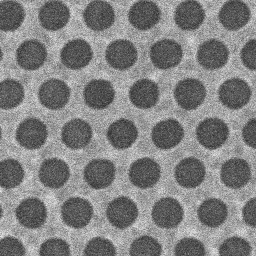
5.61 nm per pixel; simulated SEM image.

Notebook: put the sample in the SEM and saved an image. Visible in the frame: a regular array of holes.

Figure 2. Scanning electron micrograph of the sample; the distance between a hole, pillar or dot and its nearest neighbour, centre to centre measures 0.252 um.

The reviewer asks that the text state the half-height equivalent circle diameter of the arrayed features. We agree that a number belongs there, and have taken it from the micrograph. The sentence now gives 186 nm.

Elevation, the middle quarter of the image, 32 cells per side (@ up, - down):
------@@@@@------@@@@@------@@@@
@@--@@@@@@@@@---@@@@@@@@--@@@@@@
@@@@@@@@@@@@@@@@@@@@@@@@@@@@@@@@
@@@@@@@@@@@@@@@@@@@--@@@@@@@@@--
-@@@@@------@@@@@@-----@@@@@----
-@@@@-------@@@@@-------@@@-----
--@@@--------@@@--------@@@-----
--@@---------@@@--------@@@-----
--@@@--------@@@--------@@@-----
-@@@@-------@@@@--------@@@@----
@@@@@------@@@@@@------@@@@@@---
@@@@@@@--@@@@@@@@@@--@@@@@@@@@@-
@@@@@@@@@@@@@@@@@@@@@@@@@@@@@@@@
@@--@@@@@@@@@---@@@@@@@@@@-@@@@@
@-----@@@@@@------@@@@@------@@@
-------@@@@-------@@@@--------@@
-------@@@---------@@@--------@@
-------@@@---------@@@--------@@
-------@@@---------@@---------@@
-------@@@@-------@@@@-------@@@
------@@@@@@-----@@@@@@-----@@@@
@@@-@@@@@@@@@@-@@@@@@@@@@-@@@@@@
@@@@@@@@@@@@@@@@@@@@@@@@@@@@@@@@
@@@@@@@@--@@@@@@@@@---@@@@@@@@--
-@@@@@------@@@@@------@@@@@@---
-@@@@--------@@@--------@@@@----
--@@@--------@@@--------@@@-----
--@@@--------@@@---------@@-----
-@@@@--------@@@--------@@@-----
-@@@@-------@@@@@-------@@@@----
@@@@@@------@@@@@@----@@@@@@@---
@@@@@@@--@@@@@@@@@@@@@@@@@@@@@@@